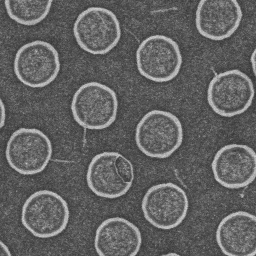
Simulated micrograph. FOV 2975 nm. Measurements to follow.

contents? a regular array of raised bodies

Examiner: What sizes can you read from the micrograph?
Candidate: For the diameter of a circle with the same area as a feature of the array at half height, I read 43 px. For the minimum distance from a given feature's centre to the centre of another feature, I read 0.784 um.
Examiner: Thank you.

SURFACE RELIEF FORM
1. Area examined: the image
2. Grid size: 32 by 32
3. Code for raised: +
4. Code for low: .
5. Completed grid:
.+++++...................++++...
.+++++.....++............+++++..
..+++.....++++...........+++++..
.........++++++..........++++...
..........+++++...........++....
....++....++++....++++..........
...++++.....+....+++++..........
..+++++..........+++++..........
..+++++..........+++++..........
..+++++...........+++......++++.
....+......................++++.
..........++++............++++++
.........+++++............+++++.
.........+++++.............++++.
.........+++++....+++...........
..........+++.....++++..........
..+++............++++++.........
.+++++...........+++++..........
.+++++............++++......+++.
.+++++......++.............+++++
.+++++.....+++.............+++++
...+.......++++............+++++
...........++++............++++.
............++++...+++..........
....+++...........+++++.........
...+++++..........+++++.........
...+++++..........+++++.........
...+++++......+....++++.....++++
....++++.....++++..........+++++
............+++++..........+++++
............+++++..........+++++
+...........+++++...........++++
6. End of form